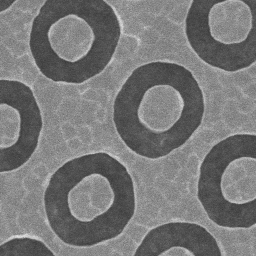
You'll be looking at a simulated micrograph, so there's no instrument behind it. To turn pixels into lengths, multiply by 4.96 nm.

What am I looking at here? ring-shaped grooves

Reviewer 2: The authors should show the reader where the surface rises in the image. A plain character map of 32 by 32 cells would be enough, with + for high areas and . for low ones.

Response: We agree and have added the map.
.++++........+++++++++++...++++.
+++++.........++++++++++..+++++.
++++...+++.....++++++++...+++++.
++++..+++++....++++++++...+++++.
++++..++++++...++++++++....++++.
++++..+++++....+++++++++........
++++...++++...++++++++++........
++++....++....+++++++++++.......
+++++........++++......++++....+
++++++......++++........++++++++
...+++++++++++++.........+++++++
....+++++++++++...++++...+++++++
....++++++++++....+++++..+++++++
++...+++++++++...++++++...++++++
+++..+++++++++...++++++..+++++++
+++..+++++++++....++++...+++++++
++...++++++++++.........++++++++
++...++++++++++........+++++....
....++++++++++++......+++++.....
....++++++....++++..++++++......
...+++++.......++++++++++....+++
+++++++.........+++++++++...++++
++++++....+++....++++++++...++++
++++++...+++++...++++++++...++++
++++++...+++++...++++++++...++++
++++++...+++++...++++++++.......
++++++...++++....+++++++++......
++++++....+.....++++++++++......
++++++..........+++......+++++++
+++++++........+++.........+++++
......++....++++++.........+++++
......+++++++++++....+++....++++